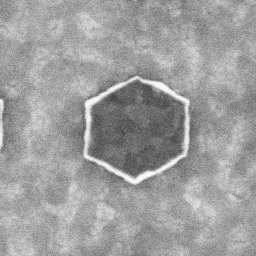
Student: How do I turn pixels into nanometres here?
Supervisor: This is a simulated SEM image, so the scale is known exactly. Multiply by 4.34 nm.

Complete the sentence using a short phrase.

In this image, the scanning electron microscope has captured raised bodies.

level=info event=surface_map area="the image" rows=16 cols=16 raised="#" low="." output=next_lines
................
................
................
................
................
.......###......
......######....
.....#######....
.....#######....
.....#######....
.......###......
................
................
................
................
................